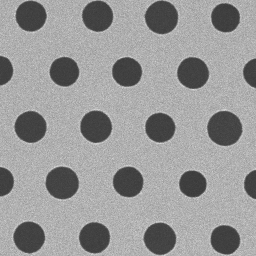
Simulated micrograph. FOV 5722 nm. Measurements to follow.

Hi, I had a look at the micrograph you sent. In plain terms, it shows a regular array of holes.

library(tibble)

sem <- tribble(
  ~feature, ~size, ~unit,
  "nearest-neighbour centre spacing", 1420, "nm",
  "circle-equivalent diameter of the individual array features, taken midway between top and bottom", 701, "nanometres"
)